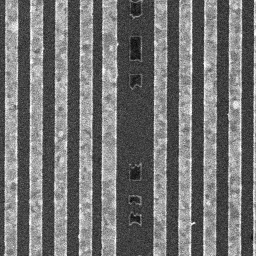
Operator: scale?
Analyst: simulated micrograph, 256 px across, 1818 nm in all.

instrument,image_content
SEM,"parallel lines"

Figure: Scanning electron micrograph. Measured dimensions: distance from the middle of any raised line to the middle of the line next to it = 176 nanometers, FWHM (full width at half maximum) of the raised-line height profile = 84.3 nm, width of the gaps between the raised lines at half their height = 0.0897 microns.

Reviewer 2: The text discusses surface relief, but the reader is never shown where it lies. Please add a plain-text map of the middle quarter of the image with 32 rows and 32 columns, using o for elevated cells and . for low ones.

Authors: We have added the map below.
o...ooo...ooo..........ooo...ooo
o...ooo...ooo..........ooo...ooo
o...ooo...ooo..........ooo...ooo
o...ooo...ooo....oo....ooo...ooo
o...ooo...ooo....oo....ooo...ooo
o...ooo...ooo....o.....ooo...ooo
o...ooo...ooo..........ooo...ooo
o...ooo...ooo..........ooo...ooo
o...ooo...ooo..........ooo...ooo
o...ooo...ooo..........ooo...ooo
o...ooo...ooo..........ooo...ooo
o...ooo...ooo..........ooo...ooo
o...ooo...ooo..........ooo...ooo
o...ooo...ooo..........ooo...ooo
o...ooo...ooo..........ooo...ooo
o...ooo...ooo..........ooo...ooo
o...ooo...ooo..........oo....ooo
o...ooo...ooo..........oo....ooo
o...ooo...ooo..........oo....ooo
o...ooo...ooo..........oo....ooo
o...ooo...ooo..........oo....ooo
o...ooo...ooo..........oo....ooo
o...ooo...ooo..........oo....ooo
o...ooo...ooo..........oo....ooo
o...ooo...ooo..........oo....ooo
o...ooo...ooo...o.o....oo....ooo
o...ooo...ooo...ooo....oo....ooo
o...ooo...ooo...ooo....oo....ooo
o...ooo...ooo...ooo....oo....ooo
o...ooo...ooo..........oo....ooo
o...ooo...ooo..........oo....ooo
o...ooo...ooo..........oo....ooo